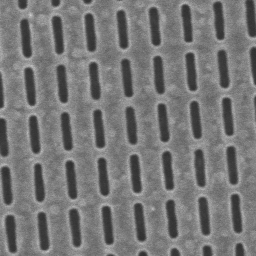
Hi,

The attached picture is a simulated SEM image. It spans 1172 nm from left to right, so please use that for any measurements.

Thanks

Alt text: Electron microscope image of a regular array of holes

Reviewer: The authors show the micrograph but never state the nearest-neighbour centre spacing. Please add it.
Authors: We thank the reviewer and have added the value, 0.148 µm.